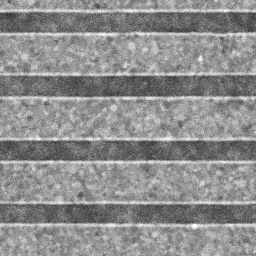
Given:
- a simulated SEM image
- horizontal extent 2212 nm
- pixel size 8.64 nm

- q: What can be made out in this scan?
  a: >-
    one or a few lines or trenches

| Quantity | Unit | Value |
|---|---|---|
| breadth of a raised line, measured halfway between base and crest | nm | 348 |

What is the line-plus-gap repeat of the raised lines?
0.554 microns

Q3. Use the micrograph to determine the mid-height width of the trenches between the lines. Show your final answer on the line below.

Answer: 198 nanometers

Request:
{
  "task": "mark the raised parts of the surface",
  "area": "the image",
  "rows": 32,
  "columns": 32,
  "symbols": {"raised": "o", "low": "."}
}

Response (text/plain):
oooooooooooooooooooooooooooooooo
................................
................................
................................
oooooooooooooooooooooooooooooooo
oooooooooooooooooooooooooooooooo
oooooooooooooooooooooooooooooooo
oooooooooooooooooooooooooooooooo
oooooooooooooooooooooooooooooooo
................................
................................
................................
oooooooooooooooooooooooooooooooo
oooooooooooooooooooooooooooooooo
oooooooooooooooooooooooooooooooo
oooooooooooooooooooooooooooooooo
oooooooooooooooooooooooooooooooo
................................
................................
................................
oooooooooooooooooooooooooooooooo
oooooooooooooooooooooooooooooooo
oooooooooooooooooooooooooooooooo
oooooooooooooooooooooooooooooooo
oooooooooooooooooooooooooooooooo
................................
................................
................................
oooooooooooooooooooooooooooooooo
oooooooooooooooooooooooooooooooo
oooooooooooooooooooooooooooooooo
oooooooooooooooooooooooooooooooo